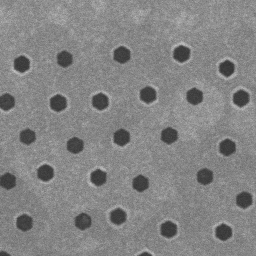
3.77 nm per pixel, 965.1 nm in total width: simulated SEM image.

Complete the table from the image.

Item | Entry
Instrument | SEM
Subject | a regular array of holes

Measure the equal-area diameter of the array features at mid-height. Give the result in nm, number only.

67.2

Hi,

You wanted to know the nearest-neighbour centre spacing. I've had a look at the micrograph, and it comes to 153 nm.